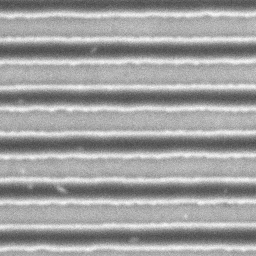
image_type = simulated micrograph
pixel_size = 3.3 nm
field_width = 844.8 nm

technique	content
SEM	lines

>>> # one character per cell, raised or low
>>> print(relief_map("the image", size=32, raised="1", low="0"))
11111111111111111111111111111111
11111111111111111111111111111111
00000000000000000000000000000000
00000000000000000000000000000000
00000000000000000000000000000000
11111111111111111111111111111111
11111111111111111111111111111111
11111111111111111111111111111111
00000000000000000000000000000000
00000000000000000000000000000000
00000000000000000000000000000000
11111111111111111111111111111111
11111111111111111111111111111111
11111111111111111111111111111111
00000000000000000000000000000000
00000000000000000000000000000000
00000000000000000000111011011111
11111111111111111111111111111111
11111111111111111111111111111111
11111111111111111111110000111111
00000000000000000000000000000000
00000000000000000000000000000000
11111111111111111111111111111111
11111111111111111111111111111111
11111111111111111111111111111111
00000000000000000000000000000000
00000000000000000000000000000000
00000000000000000000000000000000
11111111111111111111111111111111
11111111111111111111111111111111
11111111111111111111111111111111
00000000000000000000000000000000